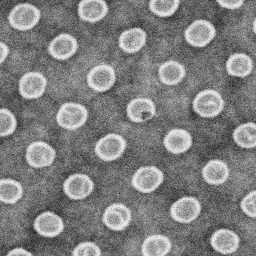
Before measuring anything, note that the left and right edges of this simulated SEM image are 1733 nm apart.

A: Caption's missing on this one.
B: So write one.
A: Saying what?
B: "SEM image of a regular array of raised bodies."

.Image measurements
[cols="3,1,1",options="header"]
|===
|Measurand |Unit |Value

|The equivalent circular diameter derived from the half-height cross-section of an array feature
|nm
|163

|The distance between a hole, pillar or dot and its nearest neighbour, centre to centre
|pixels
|48.3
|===